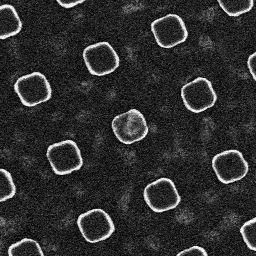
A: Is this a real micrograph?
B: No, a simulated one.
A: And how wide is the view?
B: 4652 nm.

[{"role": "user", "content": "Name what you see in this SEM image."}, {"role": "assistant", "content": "a regular array of raised bodies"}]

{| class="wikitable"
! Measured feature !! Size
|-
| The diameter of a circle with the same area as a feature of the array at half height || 32.4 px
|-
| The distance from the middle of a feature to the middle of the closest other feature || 1330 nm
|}